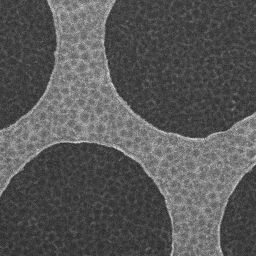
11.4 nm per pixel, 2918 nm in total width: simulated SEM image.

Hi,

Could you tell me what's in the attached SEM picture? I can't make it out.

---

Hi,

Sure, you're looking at holes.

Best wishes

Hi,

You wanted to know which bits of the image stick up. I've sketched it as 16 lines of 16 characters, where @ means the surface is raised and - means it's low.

---@@@@---------
---@@@@---------
----@@@---------
---@@@@---------
---@@@@---------
---@@@@---------
--@@@@@@--------
-@@@@@@@@------@
@@@@@@@@@@@--@@@
@@------@@@@@@@@
@--------@@@@@@@
----------@@@@@-
----------@@@@--
-----------@@@--
-----------@@@--
-----------@@@--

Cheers